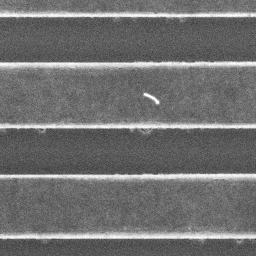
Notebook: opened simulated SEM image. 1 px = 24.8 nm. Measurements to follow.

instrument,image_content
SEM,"lines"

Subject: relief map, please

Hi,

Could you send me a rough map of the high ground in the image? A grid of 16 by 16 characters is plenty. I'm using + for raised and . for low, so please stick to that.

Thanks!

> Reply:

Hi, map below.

++++++++++++++++
................
................
................
++++++++++++++++
++++++++++++++++
++++++++++++++++
++++++++++++++++
................
................
................
++++++++++++++++
++++++++++++++++
++++++++++++++++
++++++++++++++++
................